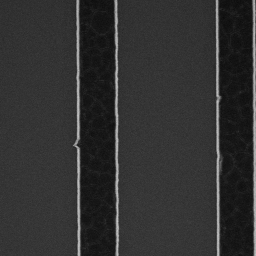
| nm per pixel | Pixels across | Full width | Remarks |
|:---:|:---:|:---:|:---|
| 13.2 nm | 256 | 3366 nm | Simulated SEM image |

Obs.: one or a few lines or trenches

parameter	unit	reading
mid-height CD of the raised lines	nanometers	498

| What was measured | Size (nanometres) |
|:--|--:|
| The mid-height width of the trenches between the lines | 1320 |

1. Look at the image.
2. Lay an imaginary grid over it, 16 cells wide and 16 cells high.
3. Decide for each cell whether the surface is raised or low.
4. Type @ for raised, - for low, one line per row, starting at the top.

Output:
-----@@-------@@
-----@@-------@@
-----@@-------@@
-----@@-------@@
-----@@-------@@
-----@@-------@@
-----@@-------@@
-----@@-------@@
-----@@-------@@
-----@@-------@@
-----@@-------@@
-----@@-------@@
-----@@-------@@
-----@@-------@@
-----@@-------@@
-----@@-------@@